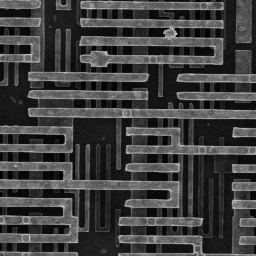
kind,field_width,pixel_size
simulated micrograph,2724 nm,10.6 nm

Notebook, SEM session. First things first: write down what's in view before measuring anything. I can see wiring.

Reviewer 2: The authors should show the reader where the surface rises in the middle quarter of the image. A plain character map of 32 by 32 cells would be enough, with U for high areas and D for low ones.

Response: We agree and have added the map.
DDDDDDDUUUUDDDDDDDDDDDDDDDDDDDDD
DDDDDDDDDDDDDDDDDDDDDDDDDDDDDDDD
UUUUUUUUUUUUUUUUUUUUUDDDDDDDDDUD
UUUUUUUUUUUUUUUUUUUUUDDDDDDDUUUU
DDDDDDDDDDDDDDDDDDDDDDDDDDDDDDDD
DDDDDDDDDDDDDDDDDDDDDDDDDDDDDDDD
DDDDDDDDDDDDDDDDDDDDDDDDDDDDDDDD
UUUUUUUUUUUUUUUUUUUUUDDDDDDDUUUU
UUUUUUUUUUUUUUUUUUUUUDDDDDDDUUUU
DDDDDDDDDDDDDDDDDDDDDDDDDDDDDDDD
DDDDDDDDDDDDDDDDDDDDDDDDDDDDDDDD
UUUUUUUUUUUUUUUUUUUUUUUUUUUUUUUU
UUUUUUUUUUUUUUUUUUUUUUUUUUUUUUUU
DDDDDDDDDDDDDDDDDDDDDDDDDDDUUUUU
DDDDDDDDDDDDDDDDDDDDDDDDDDDDDDDD
DDDDDDDDDDDDDDDDDDDDDDDDDDDDDDDD
UUDDDDDDDDDDDDDDUUUUUUUUUUUUUDDD
UUDDDDDDDDDDDDDDUUUUUUUUUUUUUDDD
UUDDDDDDDDDDDDDDDDDDDDDDDDDUUDDD
UUDDDDDDDDDDDDDDDDDDDDDDDDDUUDDD
UUDDDDDDDDDDDDDDUUUUUDDDDUUUUUUU
UUDDDDDDDDDDDDDDUUUUUUUUUUUUUUUU
DDDDDDDDDDDDDDDDDDDDDDDDDDDDDDUU
DDDDDDDDDDDDDDDDDDDDDDDDDDDDDDDD
DDDDDDDDDDDDDDDDDDDDDDDDDDDDDDDD
UUDDDDDDDDDDDDDUUUUUUUUUUUUUUDDD
UUDDDDDDDDDDDDDUUUUUUUUUUUUUUDDD
UUDDDDDDDDDDDDDDDDDDDDDDDDDDDDDD
UUDDDDDDDDDDDDDDDDDDDDDDDDDDDDDD
UUUUUUUUUUUUUUUUUUUUUUUUUUUUUDDD
UUUUUUUUUUUUUUUUUUUUUUUUUUUUUDDD
DDDDDDDDDDDDDDDDDDDDDDDDDDUUUDDD